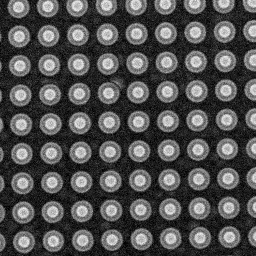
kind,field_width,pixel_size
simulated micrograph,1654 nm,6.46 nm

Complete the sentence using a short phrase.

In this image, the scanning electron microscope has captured an array of small figures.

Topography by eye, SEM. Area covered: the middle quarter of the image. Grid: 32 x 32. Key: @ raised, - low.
-@@@@@--@@@@@@--@@@@@--@@@@@---@
-@@@@@---@@@@---@@@@----@@@@---@
--@@@-----@@--------------------
-------------@------------------
------------@@@----------@@-----
--@@@@---@@@@@@-@@@@@---@@@@---@
-@@@@@---@@@@@--@@@@@--@@@@@---@
-@@@@@---@@@@@--@@@@@--@@@@@---@
-@@@@@---@@@@@--@@@@@---@@@@---@
--@@@@----@@-----@@@-----@@-----
--------------------------------
--------------------------------
---@@-----@@@----@@@----@@@@---@
--@@@@---@@@@@--@@@@@--@@@@@@--@
-@@@@@@--@@@@@--@@@@@--@@@@@@--@
-@@@@@---@@@@@--@@@@@---@@@@---@
--@@@@---@@@@----@@@----@@@-----
--------------------------------
--------------------------------
-----------@@-----@@-----@@@----
--@@@@---@@@@@--@@@@@---@@@@@--@
--@@@@@--@@@@@--@@@@@---@@@@@--@
--@@@@@--@@@@@--@@@@@---@@@@@--@
--@@@@---@@@@@---@@@@---@@@@----
---@@------@--------------------
--------------------------------
-------------------------@@-----
---@@@----@@@@---@@@@---@@@@@--@
--@@@@@--@@@@@--@@@@@@--@@@@@--@
--@@@@@--@@@@@--@@@@@@--@@@@@--@
--@@@@@--@@@@@---@@@@---@@@@----
---@@@----@@@-----@@------@-----